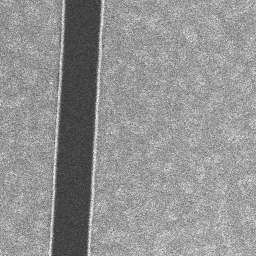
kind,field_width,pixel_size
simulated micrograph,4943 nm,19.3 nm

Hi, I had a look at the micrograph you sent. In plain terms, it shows one or a few lines or trenches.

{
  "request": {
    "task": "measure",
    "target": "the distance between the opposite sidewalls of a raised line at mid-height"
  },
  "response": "757 nm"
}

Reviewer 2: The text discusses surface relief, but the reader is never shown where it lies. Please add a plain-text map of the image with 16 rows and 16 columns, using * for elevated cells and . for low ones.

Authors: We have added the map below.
....**..........
....**..........
....**..........
....**..........
....**..........
....**..........
....**..........
....**..........
....**..........
...***..........
...***..........
...***..........
...***..........
...***..........
...***..........
...***..........